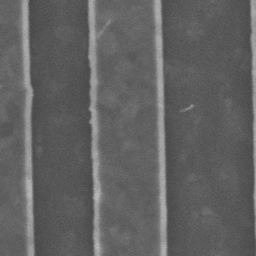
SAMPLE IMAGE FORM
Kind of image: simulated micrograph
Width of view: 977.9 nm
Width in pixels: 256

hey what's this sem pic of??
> one or a few lines or trenches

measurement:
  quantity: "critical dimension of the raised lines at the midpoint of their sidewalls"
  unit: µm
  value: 0.257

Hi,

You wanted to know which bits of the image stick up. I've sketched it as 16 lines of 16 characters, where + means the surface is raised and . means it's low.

++....++++......
++....++++......
++....++++......
++....++++......
++....++++......
++....++++......
++....++++......
++....++++......
++....++++......
++....++++......
++....++++......
++....++++......
++....++++......
++....++++......
++....++++......
++....++++......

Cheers